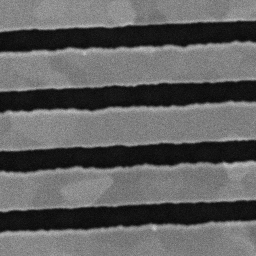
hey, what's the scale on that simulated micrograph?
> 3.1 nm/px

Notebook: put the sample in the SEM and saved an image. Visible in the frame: lines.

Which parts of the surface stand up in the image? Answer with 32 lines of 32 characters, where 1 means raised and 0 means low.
11111111111111111111111111111111
11111111111111111111111111111111
11111111111111111111111111111111
11111111100000000000000000000000
00000000000000000000000000000000
00000000000000000000000000111111
00011111111111111111111111111111
11111111111111111111111111111111
11111111111111111111111111111111
11111111111111111111111111111111
11111111111111111111000000000000
00000000000000000000000000000000
00000000000000000000000000000000
00000000000001111111111111111111
11111111111111111111111111111111
11111111111111111111111111111111
11111111111111111111111111111111
11111111111111111111111111111110
11111111000000000000000000000000
00000000000000000000000000000000
00000000000000000000001111111111
11001111111111111111111111111111
11111111111111111111111111111111
11111111111111111111111111111111
11111111111111111111111111111111
11111111111111111100000000000000
00000000000000000000000000000000
00000000000000000000000000000000
00000000000011111111111111111111
11111111111111111111111111111111
11111111111111111111111111111111
11111111111111111111111111111111